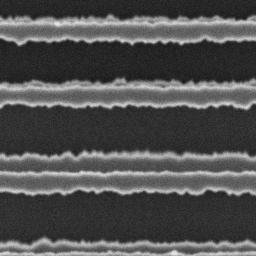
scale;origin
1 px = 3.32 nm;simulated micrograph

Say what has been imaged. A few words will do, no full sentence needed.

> lines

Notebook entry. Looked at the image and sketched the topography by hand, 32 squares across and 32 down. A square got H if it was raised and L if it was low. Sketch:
LLLLLLLLLLLLLLLLLLLLLLLLLLLLLLLL
LLLLLLLLLLLLLLLLLLLLLLLLLLLLLLLL
HHHHLHHLHHHHHHHLLHHHHLHHHHHHHLLH
HHHHHHHHHHHHHHHHHHHHHHHHHHHHHHHH
HHHHHHHHHHHHHHHHHHHHHHHHHHHHHHHH
LLHLLLLLLLLLLLLLLLLLLLLLLLLLLLLL
LLLLLLLLLLLLLLLLLLLLLLLLLLLLLLLL
LLLLLLLLLLLLLLLLLLLLLLLLLLLLLLLL
LLLLLLLLLLLLLLLLLLLLLLLLLLLLLLLL
LLLLLLLLLLLLLLLLLLLLLLLLLLLLLLLL
HLLHHHLLHHHHHLHHHHHHHHHHLHHLHHHH
HHHHHHHHHHHHHHHHHHHHHHHHHHHHHHHH
HHHHHHHHHHHHHHHHHHHHHHHHHHHHHHHH
LLLLLLLLLLLLLLLLLLLLLLLLLLLLLLHL
LLLLLLLLLLLLLLLLLLLLLLLLLLLLLLLL
LLLLLLLLLLLLLLLLLLLLLLLLLLLLLLLL
LLLLLLLLLLLLLLLLLLLLLLLLLLLLLLLL
LLLLLLLLLLLLLLLLLLLLLLLLLLLLLLLL
LLLLLLLLLLLLLLLLLLLLLLLLLLLLLLLL
LLLHHLLLHLHHHLHHHHHLHHLHLLLHHHHL
HHHHHHHHHHHHHHHHHHHHHHHHHHHHHHHH
HHHHHHHHHHHHHHHHHHHHHHHHHHHHHHHH
HHHHHHHHHHHHHHHHHHHHHHHHHHHHHHHH
HHHHHHHHHHHHHHHHHHHHHHHHHHHHHHHH
LLLLLLLLLLLLLLLLLLLLLLLLLLLLLLLL
LLLLLLLLLLLLLLLLLLLLLLLLLLLLLLLL
LLLLLLLLLLLLLLLLLLLLLLLLLLLLLLLL
LLLLLLLLLLLLLLLLLLLLLLLLLLLLLLLL
LLLLLLLLLLLLLLLLLLLLLLLLLLLLLLLL
LLLLLLLLLLLLLLLLLLLLLLLLLLLLLLLL
LHLLHHHHHHHHHHHLLHHLLLHHHHHLHLHH
HHHHHHHHHHHHHHHHHHHHHHHHHHHHHHHH